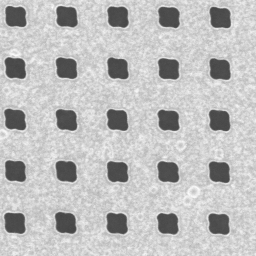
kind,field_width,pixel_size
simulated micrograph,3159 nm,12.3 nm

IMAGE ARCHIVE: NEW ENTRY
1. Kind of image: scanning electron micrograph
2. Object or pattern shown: a regular array of holes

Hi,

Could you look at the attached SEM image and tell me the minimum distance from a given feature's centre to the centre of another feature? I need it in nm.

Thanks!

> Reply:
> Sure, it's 627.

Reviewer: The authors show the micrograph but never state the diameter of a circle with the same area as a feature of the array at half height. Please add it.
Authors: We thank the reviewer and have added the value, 280 nm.